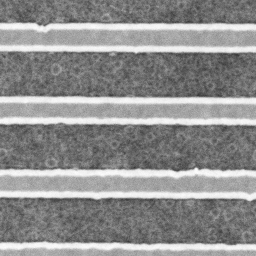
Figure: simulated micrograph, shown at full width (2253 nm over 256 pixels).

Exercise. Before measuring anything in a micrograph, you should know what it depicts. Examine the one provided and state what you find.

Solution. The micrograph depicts one or a few lines or trenches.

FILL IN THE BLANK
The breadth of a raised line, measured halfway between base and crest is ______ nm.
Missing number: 191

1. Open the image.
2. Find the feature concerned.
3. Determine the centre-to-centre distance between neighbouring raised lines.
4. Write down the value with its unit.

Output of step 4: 643 nm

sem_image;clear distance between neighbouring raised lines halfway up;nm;452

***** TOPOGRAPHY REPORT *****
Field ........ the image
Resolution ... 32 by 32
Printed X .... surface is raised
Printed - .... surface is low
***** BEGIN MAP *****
--------------------------------
--------------------------------
--------------------------------
XXXXX-XXXXXXXXXXXXXXXXXXXXXXXXXX
XXXXXXXXXXXXXXXXXXXXXXXXXXXXXXXX
XXXXXXXXXXXXXXXXXXXXXXXXXXXXXXXX
--------------------------------
--------------------------------
--------------------------------
--------------------------------
--------------------------------
--------------------------------
XXXXXX-XXXX-XX------------------
XXXXXXXXXXXXXXXXXXXXXXXXXXXXXXXX
XXXXXXXXXXXXXXXXXXXXXXXXXXXXXXXX
--------------------------------
--------------------------------
--------------------------------
--------------------------------
--------------------------------
--------------------------------
-------XX-----------------------
XXXXXXXXXXXXXXXXXXXXXXXXXXXXXXXX
XXXXXXXXXXXXXXXXXXXXXXXXXXXXXXXX
------------------------------XX
--------------------------------
--------------------------------
--------------------------------
--------------------------------
--------------------------------
--------------------------------
XXXXXXXXXXXXXXXXXXXXXXXXXXXXXXXX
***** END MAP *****